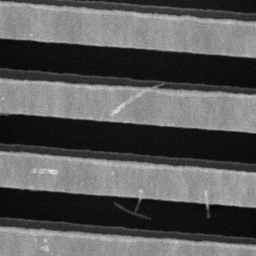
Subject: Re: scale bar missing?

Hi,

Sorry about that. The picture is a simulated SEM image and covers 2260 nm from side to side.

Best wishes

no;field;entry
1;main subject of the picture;lines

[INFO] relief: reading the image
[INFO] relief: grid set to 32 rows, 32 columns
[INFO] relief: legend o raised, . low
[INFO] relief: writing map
oooooooooooooooo................
ooooooooooooooooooooooooooooo...
oooooooooooooooooooooooooooooooo
oooooooooooooooooooooooooooooooo
oooooooooooooooooooooooooooooooo
..........oooooooooooooooooooooo
.......................ooooooooo
................................
................................
ooooooooooo.....................
oooooooooooooooooooooooo........
oooooooooooooooooooooooooooooooo
oooooooooooooooooooooooooooooooo
oooooooooooooooooooooooooooooooo
....oooooooooooooooooooooooooooo
..................oooooooooooooo
...............................o
................................
ooooooo.........................
ooooooooooooooooooo.............
ooooooooooooooooooooooooooooooo.
oooooooooooooooooooooooooooooooo
oooooooooooooooooooooooooooooooo
.ooooooooooooooooooooooooooooooo
..............oooooooooooooooooo
.........................ooooooo
................................
ooo.............................
ooooooooooooooo.................
ooooooooooooooooooooooooooo.....
oooooooooooooooooooooooooooooooo
oooooooooooooooooooooooooooooooo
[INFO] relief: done